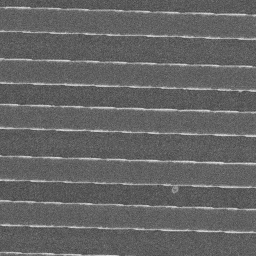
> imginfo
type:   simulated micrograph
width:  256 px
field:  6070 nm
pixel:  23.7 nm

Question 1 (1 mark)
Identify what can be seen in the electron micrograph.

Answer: lines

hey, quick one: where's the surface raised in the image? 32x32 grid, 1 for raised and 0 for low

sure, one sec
00000000000000000000000000000000
11111111111111111110000000000000
11111111111111111111111111111111
11111111111111111111111111111111
00000000000000000011111111111111
00000000000000000000000000000000
00000000000000000000000000000000
11110000000000000000000000000000
11111111111111111111111111111111
11111111111111111111111111111111
00001111111111111111111111111111
00000000000000000000000000000000
00000000000000000000000000000000
11111111111111000000000000000000
11111111111111111111111111111111
11111111111111111111111111111111
00000000000000011111111111111111
00000000000000000000000000000000
00000000000000000000000000000000
10000000000000000000000000000000
11111111111111111111111111111111
11111111111111111111111111111111
11111111111111111111111111111111
00000000000000000000000000000000
00000000000000000000000000000000
11111111111100000000000000000000
11111111111111111111111111111111
11111111111111111111111111111111
00000000000011111111111111111111
00000000000000000000000000000000
00000000000000000000000000000000
00000000000000000000000000000000